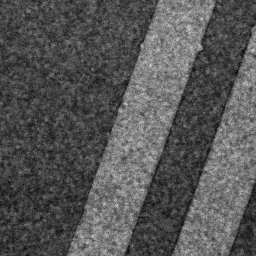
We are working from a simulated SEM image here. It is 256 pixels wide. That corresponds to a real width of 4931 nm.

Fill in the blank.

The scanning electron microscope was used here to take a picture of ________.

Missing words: one or a few lines or trenches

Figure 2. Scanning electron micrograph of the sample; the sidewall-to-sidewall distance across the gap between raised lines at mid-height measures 0.874 um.